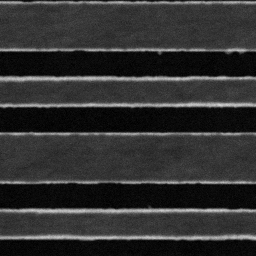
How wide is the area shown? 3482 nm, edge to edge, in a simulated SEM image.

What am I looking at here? lines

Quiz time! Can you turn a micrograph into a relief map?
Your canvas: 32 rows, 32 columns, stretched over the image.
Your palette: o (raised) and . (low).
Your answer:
oooooooooooooooooooooooooooooooo
oooooooooooooooooooooooooooooooo
oooooooooooooooooooooooooooooooo
oooooooooooooooooooooooooooooooo
oooooooooooooooooooooooooooooooo
oooooooooooooooooooooooooooooooo
................................
................................
................................
................................
oooooooooooooooooooooooooooooooo
oooooooooooooooooooooooooooooooo
oooooooooooooooooooooooooooooooo
................................
................................
................................
................................
oooooooooooooooooooooooooooooooo
oooooooooooooooooooooooooooooooo
oooooooooooooooooooooooooooooooo
oooooooooooooooooooooooooooooooo
oooooooooooooooooooooooooooooooo
oooooooooooooooooooooooooooooooo
................................
................................
................................
oooooooooooooooooooooooooooooooo
oooooooooooooooooooooooooooooooo
oooooooooooooooooooooooooooooooo
oooooooooooooooooooooooooooooooo
................................
................................